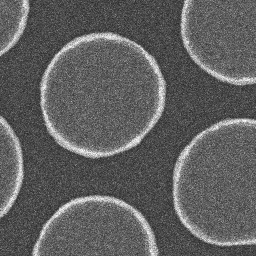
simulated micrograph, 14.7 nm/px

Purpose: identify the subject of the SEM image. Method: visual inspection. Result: raised bodies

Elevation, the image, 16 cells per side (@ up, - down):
@@---------@@@@@
@----------@@@@@
@----@@@----@@@@
---@@@@@@---@@@@
---@@@@@@@---@@@
---@@@@@@@------
---@@@@@@@------
---@@@@@@@-----@
@--@@@@@@---@@@@
@----@@-----@@@@
@----------@@@@@
@----------@@@@@
@----@@----@@@@@
---@@@@@@--@@@@@
---@@@@@@---@@@@
--@@@@@@@@------